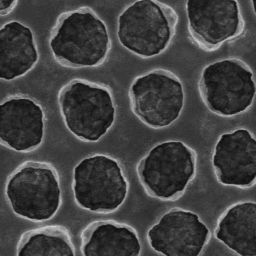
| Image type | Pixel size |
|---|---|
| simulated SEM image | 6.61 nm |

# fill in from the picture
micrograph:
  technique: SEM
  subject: holes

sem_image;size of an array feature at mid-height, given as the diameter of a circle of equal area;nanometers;357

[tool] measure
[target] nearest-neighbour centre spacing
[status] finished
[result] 0.461 micrometres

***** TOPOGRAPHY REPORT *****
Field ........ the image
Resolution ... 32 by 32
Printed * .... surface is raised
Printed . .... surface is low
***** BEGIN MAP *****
.****************..****.......**
**********.*****.....**.......**
********....***......***......**
...****......**......***......**
....***......**......***.....***
....**........*......*****.*****
.....**......****...************
....****.....****************.**
....**********************.....*
..****************...****......*
*********..******......**.......
********.....***.......**.......
*...***.......***......***.....*
.....***......***......***.....*
.....***......***.....**********
.....***......****...***********
.....****....****************..*
.....******.***************.....
**..***************....****.....
******************......***.....
****.*****.....**.......***.....
**....***......**.......***.....
*......**......***......***.....
*......**.......**.....*********
*......**.......***..***********
*......***.....***************..
**.....**************..******...
********************.....***....
************....***.......*.....
****....***......**.......*.....
***......**......**.......**....
**.......*.......***.....*****..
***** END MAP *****